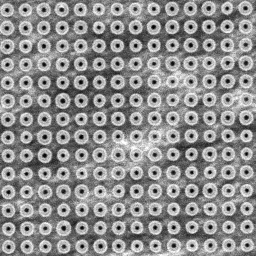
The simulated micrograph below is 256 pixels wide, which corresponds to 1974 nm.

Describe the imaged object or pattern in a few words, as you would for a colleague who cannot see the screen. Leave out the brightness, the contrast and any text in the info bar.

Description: a regular array of ring-shaped raised bodies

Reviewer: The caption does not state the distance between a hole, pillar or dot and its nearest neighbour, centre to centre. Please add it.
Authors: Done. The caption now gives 139 nanometres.